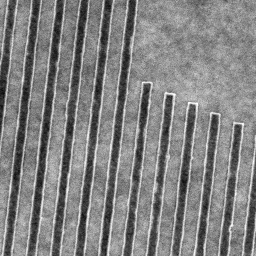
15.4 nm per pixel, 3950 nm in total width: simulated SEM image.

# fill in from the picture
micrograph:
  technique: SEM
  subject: parallel lines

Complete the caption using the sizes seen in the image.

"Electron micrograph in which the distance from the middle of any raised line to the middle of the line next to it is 367 nanometres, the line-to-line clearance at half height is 213 nanometres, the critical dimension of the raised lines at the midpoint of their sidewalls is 0.157 um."